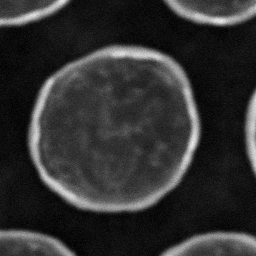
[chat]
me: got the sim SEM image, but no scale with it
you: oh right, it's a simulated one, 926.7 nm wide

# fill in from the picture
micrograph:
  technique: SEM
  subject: raised bodies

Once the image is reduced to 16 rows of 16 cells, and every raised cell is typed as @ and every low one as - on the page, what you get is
@@@--------@@@@@
----------------
----------------
------@@@@------
----@@@@@@@-----
---@@@@@@@@@----
--@@@@@@@@@@----
--@@@@@@@@@@----
--@@@@@@@@@@----
--@@@@@@@@@@----
--@@@@@@@@@@----
---@@@@@@@@-----
----@@@@@-------
----------------
----------------
@@@@-------@@@@@